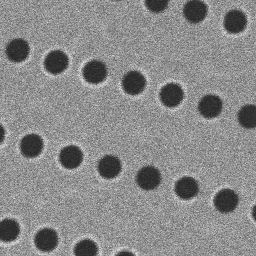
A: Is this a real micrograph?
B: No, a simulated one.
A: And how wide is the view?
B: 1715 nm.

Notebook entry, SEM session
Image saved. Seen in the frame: a regular array of holes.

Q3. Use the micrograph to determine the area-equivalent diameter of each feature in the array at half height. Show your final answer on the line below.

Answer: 168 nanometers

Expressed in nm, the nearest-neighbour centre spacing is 266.